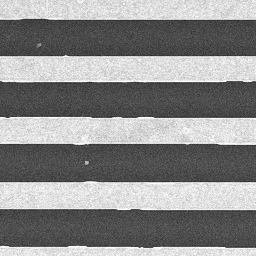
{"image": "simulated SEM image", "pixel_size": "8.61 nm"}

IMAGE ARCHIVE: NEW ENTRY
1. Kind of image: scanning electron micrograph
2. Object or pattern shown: lines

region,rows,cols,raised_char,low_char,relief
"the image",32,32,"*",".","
********************************
********************************
................................
................................
................................
................................
................................
********************************
********************************
********************************
................................
................................
................................
................................
................................
********************************
********************************
********************************
................................
................................
................................
................................
................................
********************************
********************************
********************************
................................
................................
................................
................................
................................
********************************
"